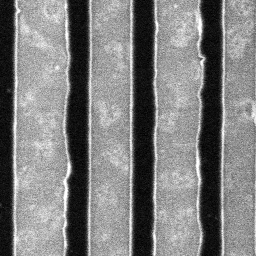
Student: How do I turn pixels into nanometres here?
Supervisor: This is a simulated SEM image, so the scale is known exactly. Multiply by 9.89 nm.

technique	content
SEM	one or a few lines or trenches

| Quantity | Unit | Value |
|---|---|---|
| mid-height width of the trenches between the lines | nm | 410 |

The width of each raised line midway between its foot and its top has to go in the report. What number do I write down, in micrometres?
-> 0.247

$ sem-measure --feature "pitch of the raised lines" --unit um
0.658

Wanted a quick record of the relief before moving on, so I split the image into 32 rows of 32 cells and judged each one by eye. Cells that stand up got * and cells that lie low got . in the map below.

**......***.....***......***....
**......***.....***......***....
**......***.....****.....***....
**......***.....****.....***....
**......***.....****.....***....
**......***.....***......***....
**......***.....***......***....
**......***.....***......***....
**......***.....****.....***....
**......***.....****.....***....
**......***.....***......***....
**......***.....****.....***....
**......***.....****.....***....
**......***.....****.....***....
**......***.....****.....***....
**......***.....****.....***....
**......***.....***......***....
**......***.....****.....***....
**......***.....***......***....
**......***.....***......***....
**.......**.....***......***....
**.......**.....***......***....
**......***.....***......***....
**......***.....***......***....
**......***.....***......***....
**......***.....***......***....
**......***.....***......***....
**......***.....***......***....
**......***.....***......***....
**......***.....***......***....
**......***.....***......***....
**......***.....***......***....